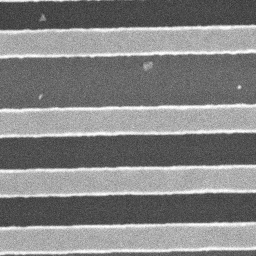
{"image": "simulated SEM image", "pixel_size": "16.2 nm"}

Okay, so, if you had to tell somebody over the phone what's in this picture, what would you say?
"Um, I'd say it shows lines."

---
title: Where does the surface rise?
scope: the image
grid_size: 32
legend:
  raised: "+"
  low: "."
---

................................
................................
................................
..............++++++++++++++++++
++++++++++++++++++++++++++++++++
++++++++++++++++++++++++++++++++
++++++++++++++++++++++++++++++++
................................
................................
................................
................................
................................
................................
............++++++++++++++++++++
++++++++++++++++++++++++++++++++
++++++++++++++++++++++++++++++++
++++++++++++++++++++++++++++++++
................................
................................
................................
................................
++++++++++++++++++++++++++++++++
++++++++++++++++++++++++++++++++
++++++++++++++++++++++++++++++++
+++++++++.......................
................................
................................
................................
++++++++++++++++++++++++++++++++
++++++++++++++++++++++++++++++++
++++++++++++++++++++++++++++++++
++++++++++++++..................